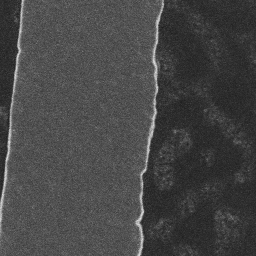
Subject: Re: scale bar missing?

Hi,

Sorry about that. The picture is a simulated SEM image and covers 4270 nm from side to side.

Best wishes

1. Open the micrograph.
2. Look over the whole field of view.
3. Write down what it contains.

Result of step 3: one or a few lines or trenches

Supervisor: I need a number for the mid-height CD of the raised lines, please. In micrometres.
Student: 2.34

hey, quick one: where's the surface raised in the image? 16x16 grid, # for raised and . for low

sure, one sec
.#########......
.#########......
.#########......
.#########......
.#########......
.#########......
.#########......
.#########......
.########.......
.########.......
#########.......
#########.......
#########.......
#########.......
#########.......
#########.......